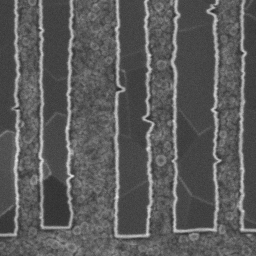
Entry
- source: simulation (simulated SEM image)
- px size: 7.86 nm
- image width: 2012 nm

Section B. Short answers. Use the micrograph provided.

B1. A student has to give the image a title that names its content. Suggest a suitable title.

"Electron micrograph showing one or a few lines or trenches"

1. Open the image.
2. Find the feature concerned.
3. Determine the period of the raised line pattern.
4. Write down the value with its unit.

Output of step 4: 0.548 micrometres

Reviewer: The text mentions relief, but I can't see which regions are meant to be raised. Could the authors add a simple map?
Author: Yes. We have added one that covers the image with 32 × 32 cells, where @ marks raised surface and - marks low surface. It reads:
@@---@@@@------@@@----@@@@@---@@
@@---@@@@------@@@----@@@@----@@
@@---@@@@------@@@----@@@@@---@@
@@---@@@@------@@@----@@@@@---@@
@@---@@@@------@@@----@@@@@---@@
@@---@@@@------@@@----@@@@@---@@
@@---@@@@------@@@----@@@@@---@@
@@---@@@@------@@@@---@@@@@---@@
@@---@@@@------@@@@---@@@@@---@@
@@---@@@@------@@@@---@@@@@---@@
@@---@@@@------@@@----@@@@@---@@
@@---@@@@------@@@@---@@@@@---@@
@@---@@@@------@@@----@@@@@---@@
@@---@@@@------@@@@---@@@@@---@@
@@---@@@@------@@@----@@@@@---@@
@@---@@@-------@@@@---@@@@@---@@
@@---@@@-------@@@@---@@@@@---@@
@@---@@@-------@@@@---@@@@@---@@
@@---@@@@------@@@@---@@@@@---@@
@@---@@@@------@@@@---@@@@@---@@
@@---@@@@------@@@@---@@@@@---@@
@@---@@@@------@@@@---@@@@@---@@
@@---@@@@------@@@@---@@@@@---@@
@@---@@@@------@@@@---@@@@@---@@
@@---@@@@------@@@@---@@@@@---@@
@@---@@@@-----@@@@@---@@@@@---@@
@@---@@@@-----@@@@@---@@@@@---@@
@@---@@@@-----@@@@@---@@@@@---@@
@@------------@@@@----@@@@@---@@
--------------------------------
--------------------------------
--------------------------------